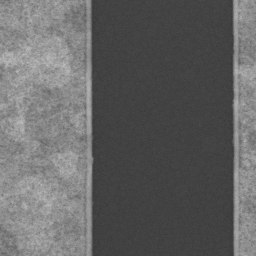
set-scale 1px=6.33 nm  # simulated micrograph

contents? one or a few lines or trenches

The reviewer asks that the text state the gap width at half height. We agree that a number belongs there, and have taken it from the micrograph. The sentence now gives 0.937 um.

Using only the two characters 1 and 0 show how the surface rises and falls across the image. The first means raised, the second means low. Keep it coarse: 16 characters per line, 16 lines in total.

1111100000000001
1111100000000001
1111100000000001
1111100000000001
1111100000000001
1111100000000001
1111110000000001
1111110000000001
1111110000000001
1111110000000001
1111110000000001
1111110000000001
1111110000000001
1111110000000001
1111110000000001
1111110000000001